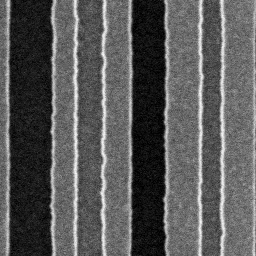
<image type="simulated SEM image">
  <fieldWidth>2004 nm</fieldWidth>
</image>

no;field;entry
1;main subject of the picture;lines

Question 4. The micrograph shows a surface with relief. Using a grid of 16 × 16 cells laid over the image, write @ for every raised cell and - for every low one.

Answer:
@--@@@@@--@@@@@@
@--@@@@@--@@@@@@
@--@@@@@--@@@@@@
@--@@@@@--@@@@@@
@--@@@@@--@@@@@@
@--@@@@@--@@@@@@
@--@@@@@--@@@@@@
@--@@@@@--@@@@@@
@--@@@@@--@@@@@@
@--@@@@@--@@@@@@
@--@@@@@--@@@@@@
@--@@@@@--@@@@@@
@--@@@@@--@@@@@@
@--@@@@@--@@@@@@
@--@@@@@--@@@@@@
@--@@@@@--@@@@@@